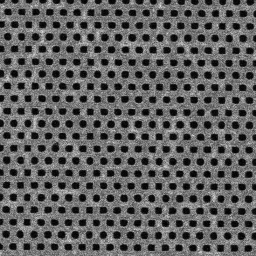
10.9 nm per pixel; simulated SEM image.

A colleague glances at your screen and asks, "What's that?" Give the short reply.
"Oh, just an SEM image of a regular array of holes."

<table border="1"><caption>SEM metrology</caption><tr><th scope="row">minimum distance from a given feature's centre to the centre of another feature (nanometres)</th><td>147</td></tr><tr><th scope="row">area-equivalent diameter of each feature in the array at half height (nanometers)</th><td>86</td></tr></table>